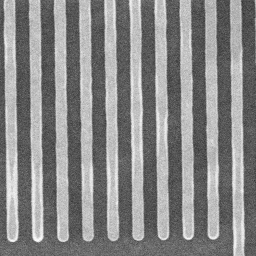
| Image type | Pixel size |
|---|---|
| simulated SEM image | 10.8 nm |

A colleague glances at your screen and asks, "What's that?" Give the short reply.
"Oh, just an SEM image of groups of lines, slits or small figures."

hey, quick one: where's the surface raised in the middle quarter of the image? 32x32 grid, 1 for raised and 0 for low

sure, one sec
00001110001110000110000110000111
00001110001110000110000110000111
00001110000110000110000110000111
00001110000110000110000110000111
00001110000110000110000110000111
00001110000110000110000110000111
00001110000110000110000111000111
00001110000110000110000111000011
10001110000110000110000111000011
10001110000110000110000111000011
10001110000110000110000111000011
10001110000110000110000111000011
10001110000110000110000111000011
10001110000110000110000011000011
10001110000110000110000010000011
10001110000110000110000010000011
10001110000110000110000010000011
10001110000110000110000010000011
10001110000110000110000010000011
10001110000110000110000010000011
10001110000110000110000011000011
10001110000110000110000111000011
10001110000110000110000111000011
10000110000110000110000111000011
10000110000110000110000111000011
10000110000110000110000111000011
10000110000110000110000111000011
10000110000110000111000111000011
10000110000110000111000011000011
10000110000110000111000011000011
10000110000110000110000011000011
10000110000110000110000011000011